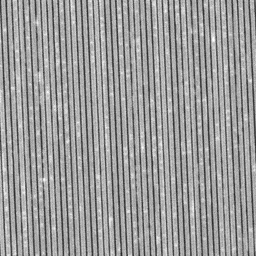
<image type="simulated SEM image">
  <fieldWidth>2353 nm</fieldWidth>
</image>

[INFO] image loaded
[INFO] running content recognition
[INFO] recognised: parallel lines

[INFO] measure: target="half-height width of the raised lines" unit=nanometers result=40.2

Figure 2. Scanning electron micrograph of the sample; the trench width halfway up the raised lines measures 16.1 nanometers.